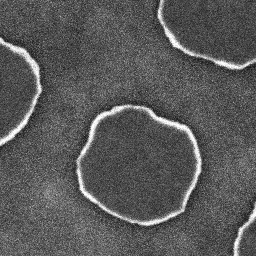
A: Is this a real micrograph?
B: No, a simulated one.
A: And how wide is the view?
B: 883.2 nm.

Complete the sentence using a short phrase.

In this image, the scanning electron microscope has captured raised bodies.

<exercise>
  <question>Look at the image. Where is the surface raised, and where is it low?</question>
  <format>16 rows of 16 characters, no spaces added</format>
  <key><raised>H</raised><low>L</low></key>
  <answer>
LLLLLLLLLLHHHHHH
LLLLLLLLLLHHHHHH
LLLLLLLLLLLHHHHH
HHLLLLLLLLLLHHHH
HHLLLLLLLLLLLLLL
HHLLLLLLLLLLLLLL
HHLLLLLLLLLLLLLL
HHLLLLHHHHLLLLLL
HLLLLLHHHHHHLLLL
LLLLLHHHHHHHLLLL
LLLLLHHHHHHHLLLL
LLLLLHHHHHHHLLLL
LLLLLLHHHHHHLLLL
LLLLLLLHHHHLLLLL
LLLLLLLLLLLLLLLH
LLLLLLLLLLLLLLLH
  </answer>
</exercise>